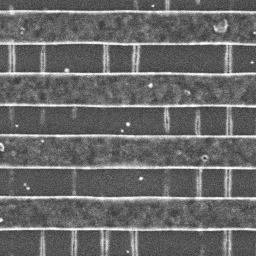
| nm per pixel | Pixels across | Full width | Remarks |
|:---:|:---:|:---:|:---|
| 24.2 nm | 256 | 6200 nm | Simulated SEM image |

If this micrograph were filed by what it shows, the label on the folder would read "wiring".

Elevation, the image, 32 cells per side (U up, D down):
DDDDDDDDDDDDDDDDDDDDDDDDDDDDDDDD
DDUDDDDDDDDDDDDDDDDDDDDDDDDDDDDD
UUUUUUUUUUUUUUUUUUUUUUUUUUUUUUUU
UUUUUUUUUUUUUUUUUUUUUUUUUUUUUUUU
UUUUUUUUUUUUUUUUUUUUUUUUUUUUUUUU
DDDDDDDDDDDDDDDDDDDDDDDDDDDDDDUU
DDDDDDDDDDDDDDDDDDDDDDDDDDDDDDDD
DDDDDDDDDDDDDDDDDDDDDDDDDDDDDDDD
DDDDDDDDDDDDDDDDDDDDDDDDDDDDDDDD
UUUUUUUUUUUUUUUUUUUUUUUUUUUUUUUU
UUUUUUUUUUUUUUUUUUUUUUUUUUUUUUUU
UUUUUUUUUUUUUUUUUUUUUUUUUUUUUUUU
UUUUUUUUUUUUUUUUUUUUUUUUUUUUUUUU
DDDDDDDDDDDDDDDDDDDDDDDDDDDDDDDD
DDDDDDDDDDDDDDDDDDDDDDDDDDDDDDDD
DDDDDDDDDDDDDDDDDDDDDDDDDDDDDDDD
DDDDDDDDDDDDDDDDDDDDDDDDDDDDDDDD
UUUUUUUUUUUUUUUUUUUUUUUUUUUUUUUU
UUUUUUUUUUUUUUUUUUUUUUUUUUUUUUUU
UUUUUUUUUUUUUUUUUUUUUUUUUUUUUUUU
UUUUUUUUUUUUUUUUUUUUUUUUUUUUUUUU
DDDDDDDDDDDDDDDDDDDDDDDDDDDDDDDD
DDDDDDDDDDDDDDDDDDDDDDDDDDDDDDDD
DDDDDDDDDDDDDDDDDDDDDDDDDDDDDDDD
DDDDDDDDDDDDDDDDDDDDDDDDDDDDDDDD
UUUUUUUUUUUUUUUUUUUUUUUUUUUUUUUU
UUUUUUUUUUUUUUUUUUUUUUUUUUUUUUUU
UUUUUUUUUUUUUUUUUUUUUUUUUUUUUUUU
UUUUUUUUUUUUUUUUUUUUUUUUUUUUUUUU
DDDDDDDDDDDDDDDDDDDDDDDDDDDDDDDD
DDDDDDDDDDDDDDDDDDDDDDDDDDDDDDDD
DDDDDDDDDDDDDDDDDDDDDDDDDDDDDDDD